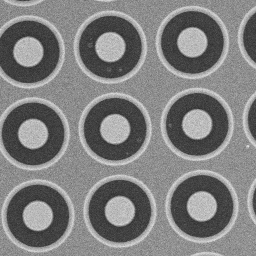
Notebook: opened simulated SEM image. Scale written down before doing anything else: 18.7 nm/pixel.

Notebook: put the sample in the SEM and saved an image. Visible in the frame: an array of small figures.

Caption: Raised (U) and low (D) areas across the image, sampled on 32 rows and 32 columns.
UUUUUUUUUUUUUUUUUUUUUUUUUUUUUUUU
UUUUUUUUUUUUUUUUUUUUUUDDDDUUUUUU
UUDDDUUUUUUDDDDDUUUUUDDDDDDUUUUD
UDDDDDDUUUDDDDDDDUUUDDDDDDDDUUDD
DDDDDDDUUUDDDUUDDDUUDDUUUUDDUUDD
DDUUUDDDUUDDUUUUDDUUDDUUUUDDUUDD
DDUUUDDDUUDDUUUDDDUUDDDUUDDDUUDD
DDUUUDDDUUDDDUUDDDUUDDDDDDDDUUUD
DDDDDDDUUUUDDDDDDUUUUDDDDDDUUUUU
UDDDDDDUUUUUDDDDUUUUUUUUUUUUUUUU
UUDDDUUUUUUUUUUUUUUUUUUUUUUUUUUU
UUUUUUUUUUUUUUUUUUUUUUUDDDUUUUUU
UUUUUUUUUUUUDDDDDUUUUUDDDDDDUUUD
UDDDDDDUUUUDDDDDDDUUUDDDDDDDUUUD
UDDDDDDDUUUDDDUDDDUUUDDUUUDDDUUD
DDDUUDDDUUDDDUUUDDDUDDDUUUDDDUUD
DDUUUUDDUUDDDUUUDDDUUDDUUUDDDUUD
DDDUUUDDUUDDDUUUDDUUUDDDDDDDUUUU
DDDDUDDDUUUDDDDDDDUUUUDDDDDDUUUU
UDDDDDDUUUUUDDDDDUUUUUUDDDUUUUUU
UUDDDDUUUUUUUUUUUUUUUUUUUUUUUUUU
UUUUUUUUUUUUUUUUUUUUUUUUUUUUUUUU
UUUUUUUUUUUUUDDDDUUUUUUDDDDDUUUU
UUDDDDDUUUUUDDDDDDUUUUDDDDDDDUUU
UDDDDDDDUUUDDDDDDDDUUDDDUUDDDUUD
UDDDUUDDDUUDDUUUUDDUUDDUUUUDDUUD
UDDUUUDDDUUDDUUUUDDUUDDDUUUDDUUD
UDDUUUDDDUUDDDUUDDDUUDDDDUDDDUUU
UDDDUUDDDUUDDDDDDDDUUUDDDDDDDUUU
UDDDDDDDUUUUDDDDDDUUUUUDDDDUUUUU
UUDDDDDUUUUUUUDDUUUUUUUUUUUUUUUU
UUUUUUUUUUUUUUUUUUUUUUUUUUUUUUUU